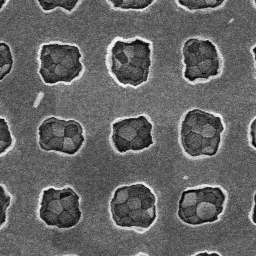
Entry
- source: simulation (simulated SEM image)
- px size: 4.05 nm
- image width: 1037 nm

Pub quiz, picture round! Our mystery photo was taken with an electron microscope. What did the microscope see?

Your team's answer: a regular array of holes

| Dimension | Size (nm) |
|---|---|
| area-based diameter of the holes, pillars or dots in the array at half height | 171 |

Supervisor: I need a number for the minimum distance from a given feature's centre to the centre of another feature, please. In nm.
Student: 282